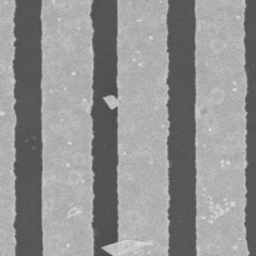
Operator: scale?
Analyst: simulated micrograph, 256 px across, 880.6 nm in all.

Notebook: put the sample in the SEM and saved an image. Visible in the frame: lines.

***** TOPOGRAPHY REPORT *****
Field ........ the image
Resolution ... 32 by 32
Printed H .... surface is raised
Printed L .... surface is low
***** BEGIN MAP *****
HHLLLHHHHHHLLLLHHHHHHLLLHHHHHHHL
HHLLLHHHHHHLLLLHHHHHHLLLHHHHHHLL
HHLLLHHHHHHLLLLHHHHHHLLLLHHHHHLL
HHLLLHHHHHHHLLLHHHHHHLLLLHHHHHLL
HHLLLHHHHHHHLLLHHHHHHLLLHHHHHHHL
HHLLLHHHHHHHLLLHHHHHHLLLHHHHHHLL
HHLLLHHHHHHHLLLHHHHHHLLLHHHHHHHL
HHLLLHHHHHHHLLLHHHHHHLLLHHHHHHHL
HHLLLHHHHHHHLLLHHHHHHLLLHHHHHHHL
HHLLLHHHHHHHLLLHHHHHHLLLLHHHHHHL
HHLLLHHHHHHHLLLHHHHHHLLLHHHHHHHL
HHLLLHHHHHHHLLLHHHHHHLLLLHHHHHHL
HHLLLHHHHHHHLHHHHHHHHLLLLHHHHHHL
HHLLLHHHHHHLLLHHHHHHHLLLHHHHHHHL
HHLLLHHHHHHLLLLHHHHHHLLLHHHHHHHL
HHLLLHHHHHHHLLLHHHHHHLLLLHHHHHHL
HHLLLHHHHHHHLLLHHHHHHLLLLHHHHHHL
HHLLLHHHHHHHLLLHHHHHHLLLHHHHHHHL
HHLLLHHHHHHLLLLHHHHHHLLLHHHHHHHL
HHLLLHHHHHHLLLLHHHHHHLLLLHHHHHHL
HHLLLHHHHHHLLLLHHHHHHLLLLHHHHHHL
HHLLLHHHHHHHLLLHHHHHHLLLLHHHHHHL
HHLLLHHHHHHHLLLHHHHHHLLLLHHHHHHL
HHLLLHHHHHHHLLLHHHHHHLLLLHHHHHHL
HHLLLHHHHHHHLLLHHHHHHLLLLHHHHHHL
HHLLLHHHHHHHLLLHHHHHHLLLLHHHHHHL
HHLLLHHHHHHHLLLHHHHHHLLLLHHHHHHL
HHLLLHHHHHHHLLLHHHHHHLLLLHHHHHHL
HHLLLHHHHHHHLLLHHHHHHLLLLHHHHHHL
HHLLLHHHHHHHLLLHHHHHHLLLLHHHHHHL
HHLLLHHHHHHHLLHHHHHHHLLLLHHHHHHL
HHLLLHHHHHHHLHHHHHHHHLLLLHHHHHHL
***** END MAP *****